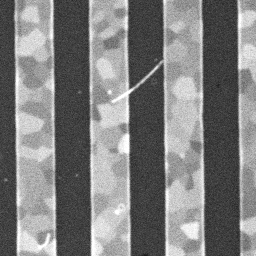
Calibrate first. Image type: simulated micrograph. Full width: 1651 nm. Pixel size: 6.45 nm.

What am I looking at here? wiring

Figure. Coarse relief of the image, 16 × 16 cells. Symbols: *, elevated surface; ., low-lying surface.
.**...**..***..*
.**...**..***..*
.**...**..***..*
.**...**..***..*
.**...**..***..*
.**...**..***..*
.**...**..***..*
.**...**..***..*
.**...**..***..*
.**...**..***..*
.**...**..***..*
.**...**..***..*
.**...**..***..*
.**...**..***..*
.**...**..***..*
.**...**..***..*